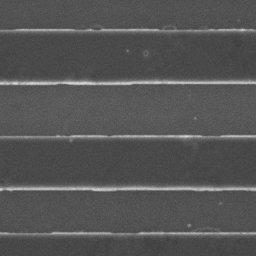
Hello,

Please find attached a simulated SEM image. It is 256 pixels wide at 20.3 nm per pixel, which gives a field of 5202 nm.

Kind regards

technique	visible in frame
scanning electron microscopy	lines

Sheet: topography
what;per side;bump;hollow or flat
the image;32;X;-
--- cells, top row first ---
--------------------------------
--------------------------------
--------------------------------
--------------------------------
XXXXXXXXXXXXXXXXXXXXXXXXXXXXXXXX
XXXXXXXXXXXXXXXXXXXXXXXXXXXXXXXX
XXXXXXXXXXXXXXXXXXXXXXXXXXXXXXXX
XXXXXXXXXXXXXXXXXXXXXXXXXXXXXXXX
XXXXXXXXXXXXXXXXXXXXXXXXXXXXXXXX
XXXXXXXXXXXXXXXXXXXXXXXXXXXXXXXX
XXXXX-----XXXXXXX---------------
--------------------------------
--------------------------------
--------------------------------
--------------------------------
--------------------------------
--------------------------------
XXXXXXXXXXXXXXXXXXXXXXXXXXXXXXXX
XXXXXXXXXXXXXXXXXXXXXXXXXXXXXXXX
XXXXXXXXXXXXXXXXXXXXXXXXXXXXXXXX
XXXXXXXXXXXXXXXXXXXXXXXXXXXXXXXX
XXXXXXXXXXXXXXXXXXXXXXXXXXXXXXXX
XXXXXXXXXXXXXXXXXXXXXXXXXXXXXXXX
XXXXXXXXXXXXXXXXXXXXXXXXXXXXXXXX
--------------------------------
--------------------------------
--------------------------------
--------------------------------
--------------------------------
XXXXXXXXXXXXXXXXXXXXXXXXXXXXXXXX
XXXXXXXXXXXXXXXXXXXXXXXXXXXXXXXX
XXXXXXXXXXXXXXXXXXXXXXXXXXXXXXXX